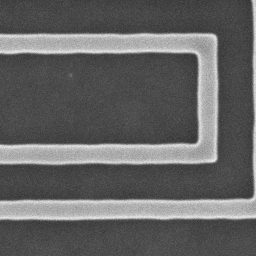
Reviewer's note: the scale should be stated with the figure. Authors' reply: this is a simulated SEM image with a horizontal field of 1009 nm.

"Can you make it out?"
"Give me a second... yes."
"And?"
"groups of lines, slits or small figures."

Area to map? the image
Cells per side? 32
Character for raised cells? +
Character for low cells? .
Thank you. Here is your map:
................................
................................
................................
................................
+++++++++++++++++++++++++++.....
+++++++++++++++++++++++++++.....
+++.+++++..++...........+++.....
.........................++.....
.........................++.....
.........................++.....
.........................++.....
.........................++.....
.........................++.....
.........................++.....
.........................++.....
.........................++.....
.........................++.....
.........................++.....
+++++++++++++++++++++++++++.....
+++++++++++++++++++++++++++.....
................................
................................
................................
................................
................................
++++++++++++++++++++++++++++++++
++++++++++++++++++++++++++++++++
................................
................................
................................
................................
................................